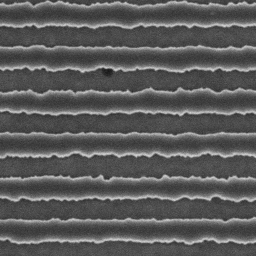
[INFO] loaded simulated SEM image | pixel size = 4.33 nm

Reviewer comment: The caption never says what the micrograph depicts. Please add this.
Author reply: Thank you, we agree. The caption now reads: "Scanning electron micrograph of lines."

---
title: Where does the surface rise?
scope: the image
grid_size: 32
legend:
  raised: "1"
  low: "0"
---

00110111100011110000011100000010
11111111111111111111111111111111
11111111111111111111111111111111
00000000000000000000000000000000
00000000000000000000000000000000
00000000000000000000000000000000
11111111111111111111111111111111
11111111111111111111111111111111
11111111111101111111111111111111
00000000000000000000000000000000
00000000000000000000000000000000
01110011101100100111101111101111
11111111111111111111111111111111
11111111111111111111111111111111
00000000000000000000000000000000
00000000000000000000000000000000
00000000000000000000000000000000
11111111111111111111111111111111
11111111111111111111111111111111
11111111000000000010110110001001
00000000000000000000000000000000
00000000000000000000000000000000
11111111111111111111111111111111
11111111111111111111111111111111
11111111111111111111111111111111
00000000000000000000000000000000
00000000000000000000000000000000
11100011011110111111111111110111
11111111111111111111111111111111
11111111111111111111111111111111
00000000000000000000000100000000
00000000000000000000000000000000